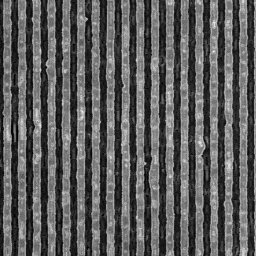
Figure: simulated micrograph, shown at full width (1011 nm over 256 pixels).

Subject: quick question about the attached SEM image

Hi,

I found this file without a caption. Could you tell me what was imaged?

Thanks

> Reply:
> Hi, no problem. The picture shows parallel lines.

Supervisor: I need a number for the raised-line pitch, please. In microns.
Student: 0.0582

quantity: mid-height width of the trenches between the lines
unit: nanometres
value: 31.1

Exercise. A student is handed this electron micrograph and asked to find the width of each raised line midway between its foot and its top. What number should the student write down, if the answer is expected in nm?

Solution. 27.6